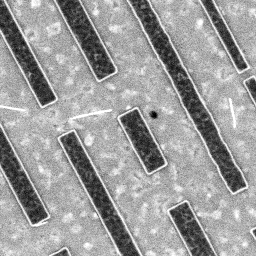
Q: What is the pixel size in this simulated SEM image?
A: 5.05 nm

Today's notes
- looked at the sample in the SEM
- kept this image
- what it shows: one or a few lines or trenches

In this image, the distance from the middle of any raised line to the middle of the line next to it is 0.316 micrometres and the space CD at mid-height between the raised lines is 43.6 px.